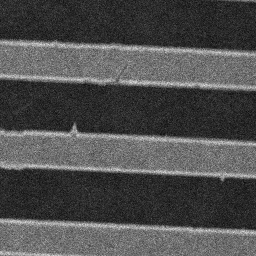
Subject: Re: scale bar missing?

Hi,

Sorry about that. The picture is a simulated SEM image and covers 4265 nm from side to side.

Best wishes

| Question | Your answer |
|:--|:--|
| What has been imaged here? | one or a few lines or trenches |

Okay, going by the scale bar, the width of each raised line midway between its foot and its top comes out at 555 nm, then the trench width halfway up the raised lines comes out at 934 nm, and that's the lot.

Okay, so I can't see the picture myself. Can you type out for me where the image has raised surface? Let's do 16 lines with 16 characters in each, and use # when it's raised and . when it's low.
................
................
................
################
################
................
................
................
######..........
################
.....###########
................
................
................
###############.
################